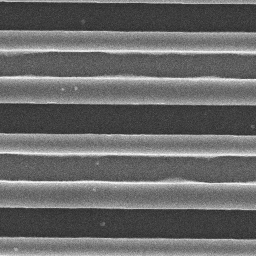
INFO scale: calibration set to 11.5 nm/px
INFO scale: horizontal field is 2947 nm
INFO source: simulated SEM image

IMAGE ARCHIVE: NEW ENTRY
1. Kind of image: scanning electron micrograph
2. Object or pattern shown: lines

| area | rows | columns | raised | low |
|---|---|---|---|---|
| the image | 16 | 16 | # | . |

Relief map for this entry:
................
................
################
################
################
################
................
................
################
################
################
################
################
................
................
################